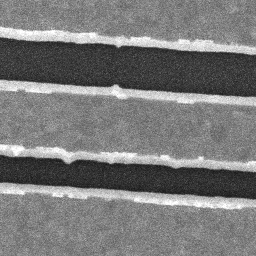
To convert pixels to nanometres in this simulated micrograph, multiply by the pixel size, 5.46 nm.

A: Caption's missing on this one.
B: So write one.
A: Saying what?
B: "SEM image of one or a few lines or trenches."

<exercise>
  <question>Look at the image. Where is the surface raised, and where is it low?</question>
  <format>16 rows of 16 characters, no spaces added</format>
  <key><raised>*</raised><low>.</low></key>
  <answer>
****************
****************
.....***********
................
................
****............
****************
****************
****************
****************
...............*
................
*************...
****************
****************
****************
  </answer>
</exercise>